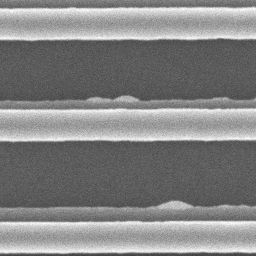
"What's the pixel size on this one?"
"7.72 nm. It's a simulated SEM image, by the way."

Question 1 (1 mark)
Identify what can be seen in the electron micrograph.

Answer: lines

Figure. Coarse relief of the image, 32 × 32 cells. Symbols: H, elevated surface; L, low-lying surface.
LLLLLLLLLLLLLLLLLLLLLLLLLLLLLLLL
HHHHHHHHHHHHHHHHHHHHHHHHHHHHHHHH
HHHHHHHHHHHHHHHHHHHHHHHHHHHHHHHH
HHHHHHHHHHHHHHHHHHHHHHHHHHHHHHHH
HHHHHHHHHHHHHHHHHHHHHHHHHHHHHHHH
LLLLLLLLLLLLLLLLLLLLLLLLLLLLLLLL
LLLLLLLLLLLLLLLLLLLLLLLLLLLLLLLL
LLLLLLLLLLLLLLLLLLLLLLLLLLLLLLLL
LLLLLLLLLLLLLLLLLLLLLLLLLLLLLLLL
LLLLLLLLLLLLLLLLLLLLLLLLLLLLLLLL
LLLLLLLLLLLLLLLLLLLLLLLLLLLLLLLL
LLLLLLLLLLLLLLLLLLLLLLLLLLLLLLLL
LLLLLLLLLLLLLLLLLLLLLLLLLLLLLLLL
LLLLLLLLLLLLLLLLLLLLLLLLLLLLLLLL
HHHHHHHHHHHHHHHHHHHHHHHHHHHHHHHH
HHHHHHHHHHHHHHHHHHHHHHHHHHHHHHHH
HHHHHHHHHHHHHHHHHHHHHHHHHHHHHHHH
HHHHHHHHHHHHLHHHHHHHHHHLHHHHLLLH
LLLLLLLLLLLLLLLLLLLLLLLLLLLLLLLL
LLLLLLLLLLLLLLLLLLLLLLLLLLLLLLLL
LLLLLLLLLLLLLLLLLLLLLLLLLLLLLLLL
LLLLLLLLLLLLLLLLLLLLLLLLLLLLLLLL
LLLLLLLLLLLLLLLLLLLLLLLLLLLLLLLL
LLLLLLLLLLLLLLLLLLLLLLLLLLLLLLLL
LLLLLLLLLLLLLLLLLLLLLLLLLLLLLLLL
LLLLLLLLLLLLLLLLLLLLLHHLLLLLLLLL
LLLLLLLLLLLLLLLLLLLLLLLLLLLLLLLL
LLLLLLLLLLLLLLLLLLLLLLLLLLLLLLLL
HHHHHHHHHHHHHHHHHHHHHHHHHHHHHHHH
HHHHHHHHHHHHHHHHHHHHHHHHHHHHHHHH
HHHHHHHHHHHHHHHHHHHHHHHHHHHHHHHH
HHHHHHHHHHHHHHHHHHHHHHHHLLLHHLHH